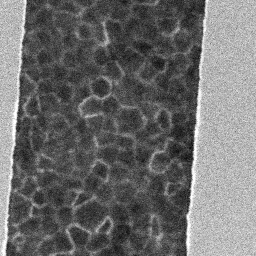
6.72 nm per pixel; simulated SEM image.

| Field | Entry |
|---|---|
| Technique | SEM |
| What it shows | one or a few lines or trenches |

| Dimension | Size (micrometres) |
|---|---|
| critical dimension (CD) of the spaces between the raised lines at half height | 1.21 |